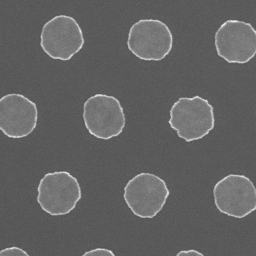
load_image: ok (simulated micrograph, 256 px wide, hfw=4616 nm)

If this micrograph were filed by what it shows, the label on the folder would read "raised bodies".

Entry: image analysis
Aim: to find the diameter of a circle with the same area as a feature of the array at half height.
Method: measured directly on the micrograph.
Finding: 770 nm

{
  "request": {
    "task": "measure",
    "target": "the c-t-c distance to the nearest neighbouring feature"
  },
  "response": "1590 nanometers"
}